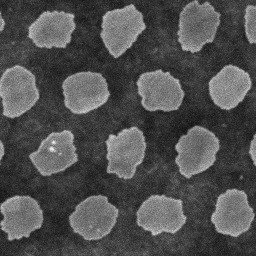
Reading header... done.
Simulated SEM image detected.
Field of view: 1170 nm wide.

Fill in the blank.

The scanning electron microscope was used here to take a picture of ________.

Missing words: a regular array of raised bodies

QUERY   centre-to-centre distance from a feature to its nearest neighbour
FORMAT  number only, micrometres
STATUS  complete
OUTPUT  0.315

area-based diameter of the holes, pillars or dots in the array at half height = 197 nm